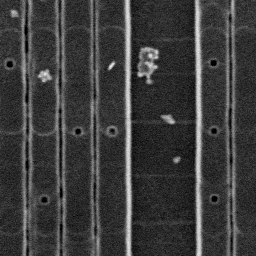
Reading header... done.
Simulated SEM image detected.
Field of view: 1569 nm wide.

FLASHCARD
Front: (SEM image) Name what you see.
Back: wiring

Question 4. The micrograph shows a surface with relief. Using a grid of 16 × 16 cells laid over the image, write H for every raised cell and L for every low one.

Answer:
HHHHHHHHLLLLHHHH
HHHHHHHHLLLLHHHH
HHHHHHHHLLLLHHHH
HHHHHHHHLLLLHHHH
HHHHHHHHLLLLHHHH
HHHHHHHHLLLLHHHH
HHHHHHHHLLLLHHHH
HHHHHHHHLLLLHHHH
HHHHHHHHLLLLHHHH
HHHHHHHHLLLLHHHH
HHHHHHHHLLLLHHHH
HHHHHHHHLLLLHHHH
HHHHHHHHLLLLHHHH
HHHHHHHHLLLLHHHH
HHHHHHHHLLLLHHHH
HHHHHHHHLLLLHHHH